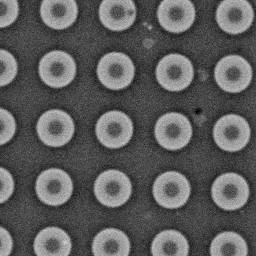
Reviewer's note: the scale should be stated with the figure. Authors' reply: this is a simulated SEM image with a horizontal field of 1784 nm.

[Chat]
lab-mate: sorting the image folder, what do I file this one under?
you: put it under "an array of small figures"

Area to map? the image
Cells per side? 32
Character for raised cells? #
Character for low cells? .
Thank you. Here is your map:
##...####....####...####....###.
##...#####..#####...####...#####
##...####....####...####...####.
.......#......##.....##.....###.
................................
................................
#......#........................
##...####....###....###.....###.
##...####...#####...####...####.
##...####...#####...####...####.
#.....##.....###....####...####.
................................
................................
................................
#....####....###....###.....##..
##...####...####....####...####.
##...####...####...#####...####.
#....####...####....####...####.
.....................#......##..
................................
................................
#.....##.....##.................
##...####...####....###....####.
##...####...####...#####...####.
#....####...####...#####...####.
......#......##.....###....###..
................................
................................
......#.........................
#....###....####....###....###..
#...#####...####...####...#####.
#...#####...####...####...#####.